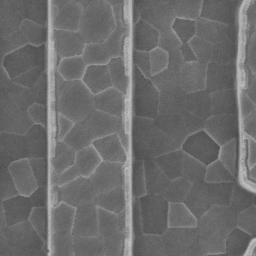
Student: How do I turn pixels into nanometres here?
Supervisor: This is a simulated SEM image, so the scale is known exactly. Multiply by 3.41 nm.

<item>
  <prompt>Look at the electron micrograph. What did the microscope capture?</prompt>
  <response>one or a few lines or trenches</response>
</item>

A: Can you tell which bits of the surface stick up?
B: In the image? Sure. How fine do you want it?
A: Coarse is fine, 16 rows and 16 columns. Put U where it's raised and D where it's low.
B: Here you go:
DDDUUUUUDDDDDDDU
DDDUUUUUDDDDDDDU
DDDUUUUUDDDDDDDU
DDDUUUUUDDDDDDDU
DDDUUUUUDDDDDDDU
DDDUUUUUDDDDDDDU
DDDUUUUUDDDDDDDU
DDDUUUUUDDDDDDDU
DDDUUUUUDDDDDDDU
DDDUUUUUDDDDDDDU
DDDUUUUUDDDDDDDU
DDDUUUUUDDDDDDDU
DDDUUUUUDDDDDDDD
DDDUUUUUDDDDDDDD
DDDUUUUUDDDDDDDD
DDDUUUUUDDDDDDDU